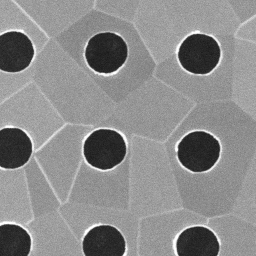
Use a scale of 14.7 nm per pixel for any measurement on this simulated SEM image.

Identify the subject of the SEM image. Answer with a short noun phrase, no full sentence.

holes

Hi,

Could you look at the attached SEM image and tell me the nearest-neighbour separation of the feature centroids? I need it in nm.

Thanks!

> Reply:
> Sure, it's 1380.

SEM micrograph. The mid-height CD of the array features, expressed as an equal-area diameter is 623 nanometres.